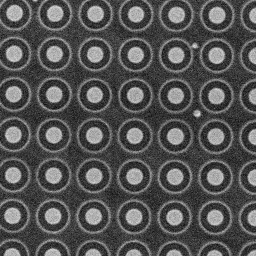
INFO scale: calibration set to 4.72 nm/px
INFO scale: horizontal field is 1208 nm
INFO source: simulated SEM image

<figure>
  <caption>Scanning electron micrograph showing an array of small figures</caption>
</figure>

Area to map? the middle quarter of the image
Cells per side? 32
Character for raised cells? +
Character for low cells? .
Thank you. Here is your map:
+++++.....+++++......++++......+
+++++++.+++++++++..++++++++..+++
++++++++++++++++++++++++++++++++
++++++++++++++++++++++++++++++++
++++++....++++++....++++++....++
.++++......++++......++++......+
.+++..+++..+++...++...++...++..+
..++..+++...++..++++..++..++++..
.+++..+++...++..++++..++..++++..
.+++...+...+++...++..+++...++..+
+++++......++++......++++......+
+++++++..+++++++...+++++++...+++
++++++++++++++++++++++++++++++++
++++++++++++++++++++++++++++++++
++++++....++++++....++++++...+++
.+++.......++++......++++......+
.+++..+++..+++...++..+++...++..+
.+++..+++...++..+++...++..++++..
.+++..+++...++..+++...++..++++..
.+++...++..+++...++..+++...++..+
+++++.....+++++......++++......+
++++++...+++++++....++++++....++
++++++++++++++++++++++++++++++++
++++++++++++++++++++++++++++++++
++++++...+++++++...++++++++..+++
.+++.......++++.....+++++.....++
.+++..+++..+++...++..+++...++..+
.++...+++..+++..+++...++..++++..
.++...+++..+++..+++...++..++++..
.+++..+++..+++..+++..+++..+++..+
++++......+++++......++++......+
++++++...+++++++....++++++....++